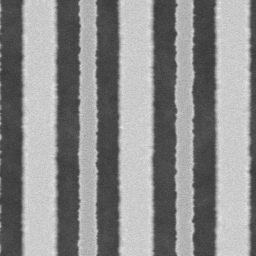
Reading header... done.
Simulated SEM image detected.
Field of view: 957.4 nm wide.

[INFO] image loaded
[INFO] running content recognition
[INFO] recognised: lines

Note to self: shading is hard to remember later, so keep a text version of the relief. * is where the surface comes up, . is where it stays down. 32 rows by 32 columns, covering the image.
...****...**...****...**...****.
...****...**...****...**...****.
...****...**...****...**...****.
...****...**...****...**...****.
...****...**...****...**...****.
...****...**...****...**...****.
...****...**...****...**...****.
...****...**...****...**...****.
...****...**...****...**...****.
...****...**...****...**...****.
...****...**...****...**...****.
...****...**...****...**...****.
...****...**...****...**...****.
...****...**...****...**...****.
...****...**...****...**...****.
...****...**...****...**...****.
...****...**...****...**...****.
...****...**...****...**...****.
...****...**...****...**...****.
...****...**...****...**...****.
...****...**...****...**...****.
...****...**...****...**...****.
...****...**...****...**...****.
...****...**...****...**...****.
...****...**...****...**...****.
...****...**...****...**...****.
...****...**...****...**...****.
...****...**...****...**...****.
...****...**...****...**...****.
...****...**...****...**...****.
...****...**...****...**...****.
...****...**...****...**...****.